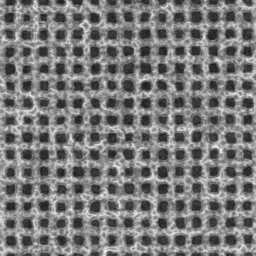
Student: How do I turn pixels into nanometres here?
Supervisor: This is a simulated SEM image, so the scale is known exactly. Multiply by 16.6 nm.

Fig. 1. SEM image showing a regular array of raised bodies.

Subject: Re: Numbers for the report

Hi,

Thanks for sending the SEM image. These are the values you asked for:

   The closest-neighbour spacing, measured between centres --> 16.5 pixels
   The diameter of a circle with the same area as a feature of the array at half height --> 0.19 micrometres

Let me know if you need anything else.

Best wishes